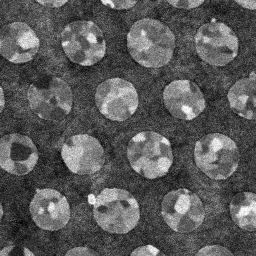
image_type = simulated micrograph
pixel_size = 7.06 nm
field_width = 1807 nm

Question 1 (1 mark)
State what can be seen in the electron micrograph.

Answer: a regular array of raised bodies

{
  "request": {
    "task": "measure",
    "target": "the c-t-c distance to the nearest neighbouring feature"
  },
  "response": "456 nm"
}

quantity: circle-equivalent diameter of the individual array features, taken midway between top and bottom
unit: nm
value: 307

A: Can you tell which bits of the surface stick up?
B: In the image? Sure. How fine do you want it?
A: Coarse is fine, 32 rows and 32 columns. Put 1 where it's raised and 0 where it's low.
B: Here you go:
00000111000001111000011110000011
00000000000000000000000000000000
00000000000000000010000000000100
11110000111100001111100001111000
11111000111110001111110001111000
11111000111110001111110001111100
11111000111110001111110001111100
01110000011100000111100000111000
00000000000000000000000000000000
00000010000000000000000000000001
00001111000001110000011100000111
00001111100011111000011110000111
00001111100011111000111110000111
00001111100011111000011110000111
00000111001001110000001100000011
00000000000000000000000000000000
00000000000000000000000000000000
11110000011100001111100001111000
11110000111110001111100011111100
11111000111110001111110011111100
11110000111110001111100001111100
01110000011100000111100001111000
00000000001000000000000000000000
00000000001000000000001000000000
00001111000111111000011110000111
00001111000111111000111110000111
00001111100011111000111110000111
00001111100011111000011110000111
00000111000001111100011100000011
00000000000000000000000000000000
00000000000000000000000000000000
11110000011100000111000001111000